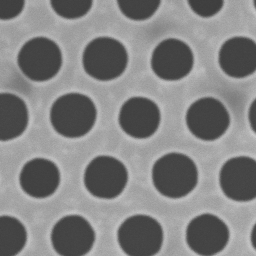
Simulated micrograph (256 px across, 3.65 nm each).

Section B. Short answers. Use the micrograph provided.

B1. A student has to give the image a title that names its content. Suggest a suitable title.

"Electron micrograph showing a regular array of holes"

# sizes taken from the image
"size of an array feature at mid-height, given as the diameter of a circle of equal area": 160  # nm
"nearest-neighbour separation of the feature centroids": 0.238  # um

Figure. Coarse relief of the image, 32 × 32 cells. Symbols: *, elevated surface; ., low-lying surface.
...***.....****.....****....****
...****....****....*****...*****
*****************.**************
********************************
********************************
***....****....*****...*****....
**......**......***.....***.....
**......**......***.....***.....
**......***.....***.....****....
***....****....*****...******..*
********************************
********************************
...****....*****...******..*****
...***......***.....****....***.
....**......***.....***......**.
...***......***.....***......**.
...****....*****...*****....****
.************************..*****
********************************
*************.******...*********
***....****....****.....****....
***....****.....***......***....
**.....***......***......**.....
***....****.....***.....****....
****..******...******..*****....
********************************
********************************
..*****....*****...*****....****
...****.....***.....***.....****
...***......***.....***......**.
...***......***.....****....****
..*****....*****....****...*****